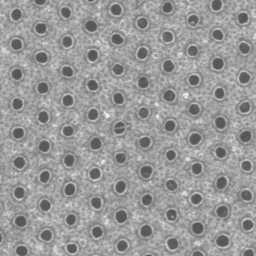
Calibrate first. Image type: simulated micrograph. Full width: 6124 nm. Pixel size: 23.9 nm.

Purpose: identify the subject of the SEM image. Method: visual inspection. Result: a regular array of raised bodies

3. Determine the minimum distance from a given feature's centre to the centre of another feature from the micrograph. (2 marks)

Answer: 0.683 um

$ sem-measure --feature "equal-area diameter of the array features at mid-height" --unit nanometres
310